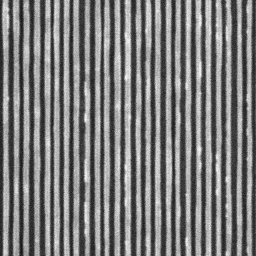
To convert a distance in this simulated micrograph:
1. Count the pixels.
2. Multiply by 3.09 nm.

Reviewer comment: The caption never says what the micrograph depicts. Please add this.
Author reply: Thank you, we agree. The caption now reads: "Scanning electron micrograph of parallel lines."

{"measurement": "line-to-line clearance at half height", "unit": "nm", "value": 18.2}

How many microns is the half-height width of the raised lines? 0.0124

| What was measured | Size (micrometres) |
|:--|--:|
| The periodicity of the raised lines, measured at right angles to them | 0.0314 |